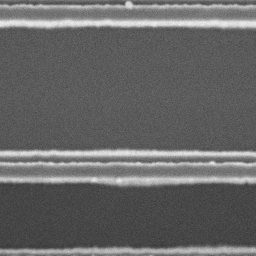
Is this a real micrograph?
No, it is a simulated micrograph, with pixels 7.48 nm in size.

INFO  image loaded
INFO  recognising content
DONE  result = lines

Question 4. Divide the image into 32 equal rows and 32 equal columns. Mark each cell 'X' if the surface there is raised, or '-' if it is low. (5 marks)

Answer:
XXXXXXXXXXXXXXXXXXXXXXXXXXXXXXXX
XXXXXXXXXXXXXXXXXXXXXXXXXXXXXXXX
XXXXXXXXXXXXXXXXXXXXXXXXXXXXXXXX
--------------------------------
--------------------------------
--------------------------------
--------------------------------
--------------------------------
--------------------------------
--------------------------------
--------------------------------
--------------------------------
--------------------------------
--------------------------------
--------------------------------
--------------------------------
--------------------------------
--------------------------------
--------------------------------
XXXXXXXXXXXXXXXXXXXXXXXXXXXXXXXX
XXXXXXXXXXXXXXXXXXXXXXXXXXXXXXXX
XXXXXXXXXXXXXXXXXXXXXXXXXXXXXXXX
---------------X----------------
--------------------------------
--------------------------------
--------------------------------
--------------------------------
--------------------------------
--------------------------------
--------------------------------
--------------------------------
--------------------------------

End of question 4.